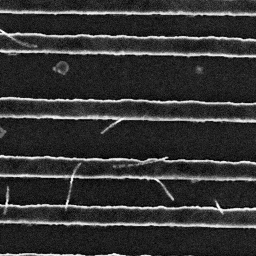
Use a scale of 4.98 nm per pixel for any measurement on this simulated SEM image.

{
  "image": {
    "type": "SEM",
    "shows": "lines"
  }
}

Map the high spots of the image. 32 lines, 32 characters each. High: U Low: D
UUUUUUUUUUUUUUUUUUUUUUUUUUUUUUUU
DUUUUUUUUUUUUUUUUUUUUUUUUUUUUUUU
DDDDDDDDDDDDDDDDDDDDDDDDDDDDDDDD
DDDDDDDDDDDDDDDDDDDDDDDDDDDDDDDD
UUUUUUUUUUUUUUUUDDDDDDDDDDDDDDDD
UUUUUUUUUUUUUUUUUUUUUUUUUUUUUUUU
DDUUUUUUUUUUUUUUUUUUUUUUUUUUUUUU
DDDDDDDDDDDDDDDDDDDDDDDDDDDDDDDD
DDDDDDDDDDDDDDDDDDDDDDDDDDDDDDDD
DDDDDDDDDDDDDDDDDDDDDDDDDDDDDDDD
DDDDDDDDDDDDDDDDDDDDDDDDDDDDDDDD
DDDDDDDDDDDDDDDDDDDDDDDDDDDDDDDD
UUUUUUDUUUUUDDDUUDDDDDDDDDDDDDDD
UUUUUUUUUUUUUUUUUUUUUUUUUUUUUUUU
UUUUUUUUUUUUUUUUUUUUUUUUUUUUUUUU
DDDDDDDDDDDDDDDDDDDDDDDDDDDDDDDD
DDDDDDDDDDDDDDDDDDDDDDDDDDDDDDDD
DDDDDDDDDDDDDDDDDDDDDDDDDDDDDDDD
DDDDDDDDDDDDDDDDDDDDDDDDDDDDDDDD
DDDDDDDDDDDDDDDDDDDDDDDDDDDDDDDD
UUUUUUUUUUUUUUUUUUUUUUUUUUUUUUUU
UUUUUUUUUUUUUUUUUUUUUUUUUUUUUUUU
DDDDDDDDDDDDDDDDDDDDDDDDDDDDDDDD
DDDDDDDDDDDDDDDDDDDDDDDDDDDDDDDD
DDDDDDDDDDDDDDDDDDDDDDDDDDDDDDDD
DDDDDDDDDDDDDDDDDDDDDDDDDDDDDDDD
UUUUUUUUUUUUUUUUUUUUUUUUUUUUUUUU
UUUUUUUUUUUUUUUUUUUUUUUUUUUUUUUU
DDDDDDDDDDDDDDDDDDDDDDDDDDDDDDDD
DDDDDDDDDDDDDDDDDDDDDDDDDDDDDDDD
DDDDDDDDDDDDDDDDDDDDDDDDDDDDDDDD
DDDDDDDDDDDDDDDDDDDDDDDDDDDDDDDD